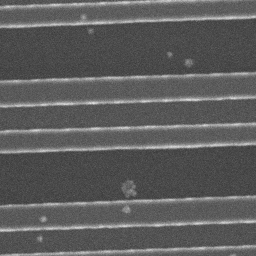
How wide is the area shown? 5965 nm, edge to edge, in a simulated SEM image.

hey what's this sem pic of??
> lines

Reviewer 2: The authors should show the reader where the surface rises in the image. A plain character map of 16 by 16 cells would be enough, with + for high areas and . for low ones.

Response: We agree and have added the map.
++++++++++++++++
++++............
................
................
................
++++++++++++++++
++++++++++++++++
++++++++++++++++
++++++++++++++++
................
................
................
..........++++++
++++++++++++++++
++++++++++++++++
++++++++++++++++